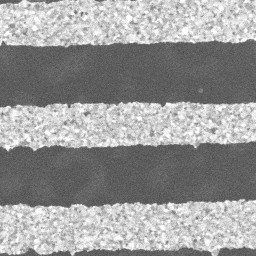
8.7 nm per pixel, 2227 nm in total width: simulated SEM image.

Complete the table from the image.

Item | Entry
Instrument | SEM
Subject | one or a few lines or trenches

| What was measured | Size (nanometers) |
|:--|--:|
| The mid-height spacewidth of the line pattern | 517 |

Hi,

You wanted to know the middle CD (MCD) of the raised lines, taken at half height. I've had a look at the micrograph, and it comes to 42.3 pixels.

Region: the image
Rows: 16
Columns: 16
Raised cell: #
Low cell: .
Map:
################
################
##########.####.
................
................
................
........##.#...#
################
################
................
................
................
................
################
################
##############..